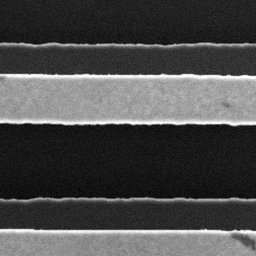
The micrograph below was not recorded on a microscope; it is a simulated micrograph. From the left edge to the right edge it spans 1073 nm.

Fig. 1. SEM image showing lines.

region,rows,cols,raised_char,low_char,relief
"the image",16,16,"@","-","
----------------
----------------
----------------
@@@@@@@@@@@@@@@@
@@@@@@@@@@@@@@@@
@@@@@@@@@@@@@@@@
@@@@@@@@@@@@@@@@
@@@@@@@@@@@@@@@@
----------------
----------------
----------------
----------------
@-@@@@@@@@@@@@@@
@@@@@@@@@@@@@@@@
@@@@@@@@@@@@@@@@
@@@@@@@@@@@@@@@@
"